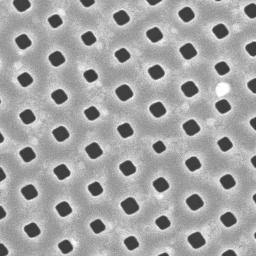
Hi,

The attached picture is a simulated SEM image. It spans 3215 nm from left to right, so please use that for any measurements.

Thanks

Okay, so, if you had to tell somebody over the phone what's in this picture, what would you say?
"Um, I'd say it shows a regular array of holes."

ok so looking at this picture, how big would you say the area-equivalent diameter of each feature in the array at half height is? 194 nm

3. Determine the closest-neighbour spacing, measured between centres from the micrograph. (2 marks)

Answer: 469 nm